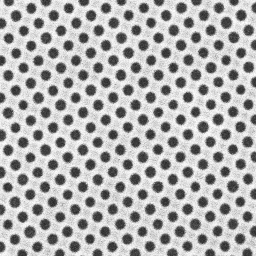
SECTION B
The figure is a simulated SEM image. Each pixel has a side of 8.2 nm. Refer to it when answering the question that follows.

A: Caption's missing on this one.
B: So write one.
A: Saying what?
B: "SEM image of a regular array of holes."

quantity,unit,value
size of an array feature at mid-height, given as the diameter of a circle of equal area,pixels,11.3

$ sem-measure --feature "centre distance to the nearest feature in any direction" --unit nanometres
135